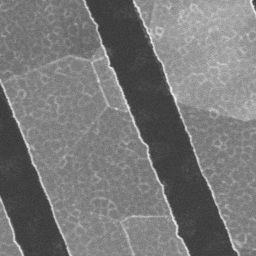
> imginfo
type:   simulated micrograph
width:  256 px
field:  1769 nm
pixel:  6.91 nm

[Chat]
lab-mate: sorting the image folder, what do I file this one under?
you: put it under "one or a few lines or trenches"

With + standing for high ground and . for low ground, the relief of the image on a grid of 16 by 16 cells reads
+++++....+++++++
++++++...+++++++
++++++...+++++++
+++++++...++++++
+++++++...++++++
++++++++...+++++
.+++++++...+++++
.+++++++...+++++
.++++++++...++++
..+++++++...++++
..++++++++...+++
...+++++++...+++
...+++++++...+++
...++++++++...++
+...+++++++...++
+...++++++++...+